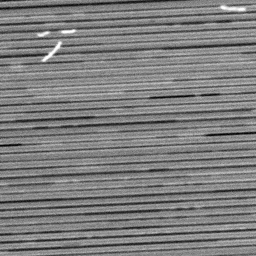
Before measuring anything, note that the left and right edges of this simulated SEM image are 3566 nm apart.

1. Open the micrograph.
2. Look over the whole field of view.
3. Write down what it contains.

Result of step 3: parallel lines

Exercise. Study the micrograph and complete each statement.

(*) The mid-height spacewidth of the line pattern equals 38.3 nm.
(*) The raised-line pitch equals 0.112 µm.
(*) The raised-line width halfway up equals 74.8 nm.